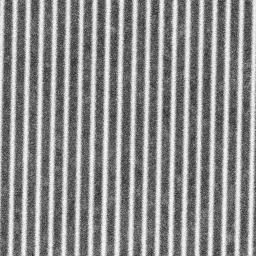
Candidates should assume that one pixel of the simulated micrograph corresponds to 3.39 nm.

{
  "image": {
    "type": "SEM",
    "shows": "parallel lines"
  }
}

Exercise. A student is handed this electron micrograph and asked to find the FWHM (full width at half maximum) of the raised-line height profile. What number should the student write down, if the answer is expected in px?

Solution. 2.86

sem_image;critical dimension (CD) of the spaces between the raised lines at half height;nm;34.7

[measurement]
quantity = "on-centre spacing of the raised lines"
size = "45.2 nm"